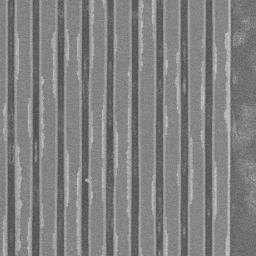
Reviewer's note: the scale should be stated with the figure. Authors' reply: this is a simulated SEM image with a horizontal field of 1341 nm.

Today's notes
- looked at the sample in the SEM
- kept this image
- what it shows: parallel lines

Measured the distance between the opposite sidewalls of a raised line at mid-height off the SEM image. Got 82.5 nm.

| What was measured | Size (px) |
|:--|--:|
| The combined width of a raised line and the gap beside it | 24.7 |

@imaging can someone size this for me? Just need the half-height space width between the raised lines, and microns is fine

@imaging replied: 0.0439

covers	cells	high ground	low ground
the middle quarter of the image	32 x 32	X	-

XXXX---XXX---XXXX--XXXX--XXXX--X
XXXX---XXX---XXXX--XXXX--XXXX--X
XXXX---XXX---XXXX--XXXX--XXXX--X
XXXX---XXX---XXXX--XXXX--XXXX--X
XXXX---XXX---XXXX--XXXX--XXXX--X
XXXX---XXX---XXXX--XXXX--XXXX--X
XXXX---XXX---XXXX--XXXX--XXXX--X
XXXX---XXX---XXXX--XXXX--XXXX--X
XXXX---XXX---XXXX--XXXX--XXXX--X
XXXX---XXX---XXXX--XXXX--XXXX--X
XXXX---XXX---XXXX--XXXX--XXXX--X
XXXX---XXX---XXXX--XXXX--XXXX--X
XXXX---XXX---XXXX--XXXX--XXXX--X
XXXX---XXX---XXXX--XXXX--XXXX--X
XXXX---XXX---XXXX--XXXX--XXXX--X
XXXX---XXX---XXXX--XXXX--XXXX--X
XXXX---XXX---XXXX--XXXX--XXXX--X
XXXX---XXX---XXXX--XXXX--XXXX--X
XXXX---XXX---XXXX--XXXX--XXXX--X
XXXX---XXX---XXXX--XXXX--XXXX--X
XXXX---XXX---XXXX--XXXX--XXXX---
XXXX---XXX---XXXX--XXXX--XXXX---
XXXX---XXX---XXXX--XXXX--XXXX---
XXXX---XXX---XXXX--XXXX--XXXX---
XXXX---XXX---XXXX--XXXX--XXXX--X
XXXX---XXX---XXXX--XXXX--XXXX--X
XXXX---XXX---XXXX--XXXX--XXXX--X
XXXX---XXX---XXXX--XXXX--XXXX--X
XXXX--XXXX---XXXX--XXXX--XXXX--X
XXXX--XXXX---XXXX--XXXX--XXXX--X
XXXX---XXX---XXXX--XXXX--XXXX--X
XXXX---XXX---XXXX--XXXX--XXXX--X